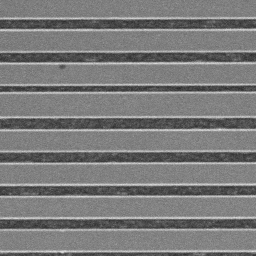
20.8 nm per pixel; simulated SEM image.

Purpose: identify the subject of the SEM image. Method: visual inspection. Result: parallel lines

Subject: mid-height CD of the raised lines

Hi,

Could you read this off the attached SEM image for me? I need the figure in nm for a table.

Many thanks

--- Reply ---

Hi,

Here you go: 444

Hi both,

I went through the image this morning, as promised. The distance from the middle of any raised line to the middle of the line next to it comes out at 691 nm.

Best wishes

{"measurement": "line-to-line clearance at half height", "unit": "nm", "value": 246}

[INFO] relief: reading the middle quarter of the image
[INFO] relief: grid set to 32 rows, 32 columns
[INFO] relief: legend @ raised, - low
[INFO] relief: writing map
@@@@@@@@@@@@@@@@@@@@@@@@@@@@@@@@
@@@@@@@@@@@@@@@@@@@@@@@@@@@@@@@@
@@@@@@@@@@@@@@@@@@@@@@@@@@@@@@@@
@@@@@@@@@@@@@@@@@@@@@@@@@@@@@@@@
@@@@@@@@@@@@@@@@@@@@@@@@@@@@@@@@
--------------------------------
--------------------------------
@@@@@@@@@@@@@@@@@@@@@@@@@@@@@@@@
@@@@@@@@@@@@@@@@@@@@@@@@@@@@@@@@
@@@@@@@@@@@@@@@@@@@@@@@@@@@@@@@@
@@@@@@@@@@@@@@@@@@@@@@@@@@@@@@@@
@@@@@@@@@@@@@@@@@@@@@@@@@@@@@@@@
@@@@@@@@@@@@@@@@@@@@@@@@@@@@@@@@
--------------------------------
--------------------------------
--------------------------------
--------------------------------
@@@@@@@@@@@@@@@@@@@@@@@@@@@@@@@@
@@@@@@@@@@@@@@@@@@@@@@@@@@@@@@@@
@@@@@@@@@@@@@@@@@@@@@@@@@@@@@@@@
@@@@@@@@@@@@@@@@@@@@@@@@@@@@@@@@
@@@@@@@@@@@@@@@@@@@@@@@@@@@@@@@@
--------------------------------
--------------------------------
--------------------------------
@@@@@@@@@@@@@@@@@@@@@@@@@@@@@@@@
@@@@@@@@@@@@@@@@@@@@@@@@@@@@@@@@
@@@@@@@@@@@@@@@@@@@@@@@@@@@@@@@@
@@@@@@@@@@@@@@@@@@@@@@@@@@@@@@@@
@@@@@@@@@@@@@@@@@@@@@@@@@@@@@@@@
--------------------------------
--------------------------------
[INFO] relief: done